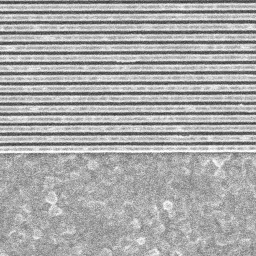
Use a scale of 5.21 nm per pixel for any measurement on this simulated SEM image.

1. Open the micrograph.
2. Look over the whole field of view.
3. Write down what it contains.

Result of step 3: parallel lines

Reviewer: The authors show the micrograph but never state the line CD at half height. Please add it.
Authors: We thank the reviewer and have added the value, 28.7 nm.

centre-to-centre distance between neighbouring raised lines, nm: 52.8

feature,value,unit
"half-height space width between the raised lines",24.1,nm